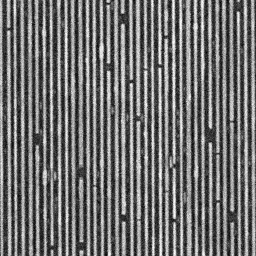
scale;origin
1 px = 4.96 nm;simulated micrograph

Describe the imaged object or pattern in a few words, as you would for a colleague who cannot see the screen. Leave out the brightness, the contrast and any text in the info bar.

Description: parallel lines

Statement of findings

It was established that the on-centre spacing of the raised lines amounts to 35.6 nanometers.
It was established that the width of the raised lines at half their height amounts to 0.013 microns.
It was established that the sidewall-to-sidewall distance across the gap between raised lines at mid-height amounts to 22.9 nanometers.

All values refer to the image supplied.